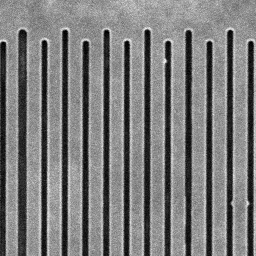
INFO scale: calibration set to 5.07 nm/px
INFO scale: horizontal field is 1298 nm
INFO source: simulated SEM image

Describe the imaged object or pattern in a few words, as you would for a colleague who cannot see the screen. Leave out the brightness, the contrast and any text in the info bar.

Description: parallel lines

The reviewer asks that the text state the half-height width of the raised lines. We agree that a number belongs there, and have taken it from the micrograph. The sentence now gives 0.0678 um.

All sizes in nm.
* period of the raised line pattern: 105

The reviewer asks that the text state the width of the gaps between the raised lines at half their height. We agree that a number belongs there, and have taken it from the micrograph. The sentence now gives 36.1 nm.